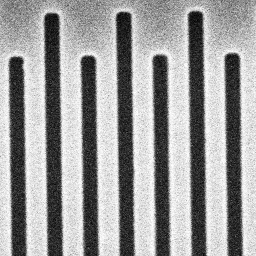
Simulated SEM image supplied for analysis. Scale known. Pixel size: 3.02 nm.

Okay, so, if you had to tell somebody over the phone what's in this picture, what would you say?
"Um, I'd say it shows parallel lines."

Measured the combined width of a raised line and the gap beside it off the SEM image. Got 109 nm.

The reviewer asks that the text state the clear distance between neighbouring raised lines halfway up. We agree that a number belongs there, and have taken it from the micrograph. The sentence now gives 47.2 nanometres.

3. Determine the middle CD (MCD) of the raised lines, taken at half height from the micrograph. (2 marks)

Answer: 61.5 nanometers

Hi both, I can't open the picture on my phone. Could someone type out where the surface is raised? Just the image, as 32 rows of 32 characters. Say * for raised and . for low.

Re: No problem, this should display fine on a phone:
********************************
***************.********.*******
*****..*******..*******..*******
*****..*******..*******..*******
*****...******...******...******
*****...******...******...******
*****...******...******...******
*..**...**..**...**..**...**..**
*..**...**..***..**..***..**..**
*..***..**..***..**..***..**..**
*..***..**..***..**..***..**..**
*..***..**..***..**..***..**..**
*..***..**..***..**..***..**..**
*..***..**..***..**..***..**..**
*..***..**..***..**..***..**..**
*..***..**..***..**..***..**..**
*..***..**..***..**..***..**..**
*..***..**..***..**..***..**..**
*..***..**..***..**..***..**..**
*..***..**..***..**..***..**..**
*..***..**..***..**..***..**..**
*..***..**..***..**..***..**..**
*..***..**..***..**..***..**..**
*..***..**..***..**..***..**..**
*..***..**..***..**..***..**..**
*..***..**..***..**..***..**..**
*..***..**..***..**..***..**..**
*..***..**..***..**..***..**..**
*..***..**..***..**..***..**..**
*..***..**..***..**..***..**..**
*..***..**..***..**..***..**..**
*..***..**...**..**..***..**..**